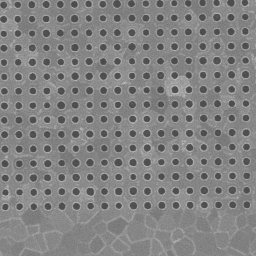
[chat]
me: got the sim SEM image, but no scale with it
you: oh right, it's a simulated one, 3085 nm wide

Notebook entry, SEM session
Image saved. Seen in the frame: a regular array of holes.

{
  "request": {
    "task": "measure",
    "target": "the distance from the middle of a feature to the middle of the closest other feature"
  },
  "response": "170 nm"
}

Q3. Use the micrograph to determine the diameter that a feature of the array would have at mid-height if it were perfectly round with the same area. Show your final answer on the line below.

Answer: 88.1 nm